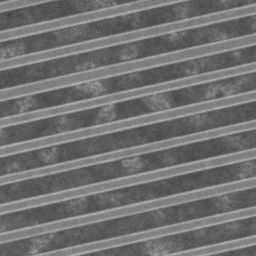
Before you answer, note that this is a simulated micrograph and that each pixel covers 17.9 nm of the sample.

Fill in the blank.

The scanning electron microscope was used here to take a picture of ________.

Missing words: parallel lines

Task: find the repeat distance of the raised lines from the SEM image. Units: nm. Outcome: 505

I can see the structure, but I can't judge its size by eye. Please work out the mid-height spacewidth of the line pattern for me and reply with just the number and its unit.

20.4 pixels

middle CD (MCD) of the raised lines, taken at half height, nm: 155